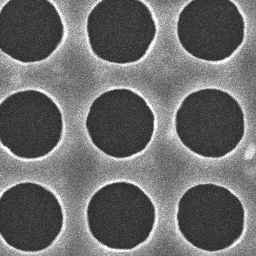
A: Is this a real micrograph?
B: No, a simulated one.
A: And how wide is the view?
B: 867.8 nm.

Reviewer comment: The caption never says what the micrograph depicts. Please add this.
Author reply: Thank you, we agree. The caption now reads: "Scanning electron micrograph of holes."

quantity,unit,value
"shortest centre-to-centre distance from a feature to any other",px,90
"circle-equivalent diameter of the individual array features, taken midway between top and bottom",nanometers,231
